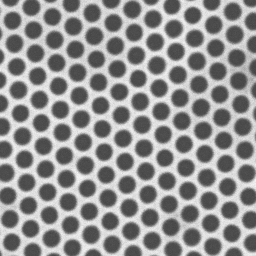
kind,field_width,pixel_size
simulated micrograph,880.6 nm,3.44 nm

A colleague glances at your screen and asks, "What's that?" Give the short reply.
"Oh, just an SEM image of a regular array of holes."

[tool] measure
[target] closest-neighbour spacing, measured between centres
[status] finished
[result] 78.9 nm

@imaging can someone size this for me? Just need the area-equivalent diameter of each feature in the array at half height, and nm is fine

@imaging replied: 58.8